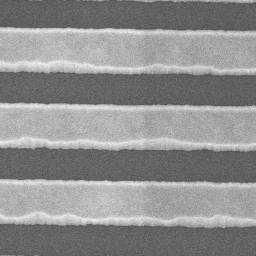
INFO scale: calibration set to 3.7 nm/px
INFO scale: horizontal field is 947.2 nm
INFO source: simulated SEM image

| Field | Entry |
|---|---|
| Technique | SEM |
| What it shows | lines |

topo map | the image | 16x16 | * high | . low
................
................
****************
****************
.......**..*****
................
**..............
****************
****************
................
................
****************
****************
****************
................
................